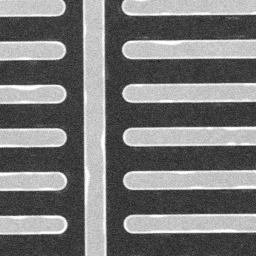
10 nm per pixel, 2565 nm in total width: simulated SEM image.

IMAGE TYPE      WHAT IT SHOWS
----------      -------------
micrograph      groups of lines, slits or small figures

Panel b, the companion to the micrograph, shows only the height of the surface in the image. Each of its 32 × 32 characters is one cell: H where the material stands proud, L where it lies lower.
HHHHHHHHLLLHHLLHHHHHHHHHHHHHHHHH
HHHHHHHHLLLHHLLLHHHHHHHHHHHHHHHH
LLLLLLLLLLLHHLLLLLLLLLLLLLLLLLLL
LLLLLLLLLLLHHLLLLLLLLLLLLLLLLLLL
LLLLLLLLLLLHHLLLLLLLLLLLLLLLLLLL
HHHHHHHHLLLHHLLLHHHHHHHHHHHHHHHH
HHHHHHHHLLLHHLLHHHHHHHHHHHHHHHHH
LLLLLLLLLLLHHLLLLLLLLLLLLLLLLLLL
LLLLLLLLLLLHHLLLLLLLLLLLLLLLLLLL
LLLLLLLLLLLHHLLLLLLLLLLLLLLLLLLL
LLLLLLLLLLLHHLLLLLLLLLLLLLLLLLLL
HHHHHHHHLLLHHLLHHHHHHHHHHHHHHHHH
HHHHHHHHLLLHHLLLHHHHHHHHHHHHHHHH
LLLLLLLLLLLHHLLLLLLLLLLLLLLLLLLL
LLLLLLLLLLLHHLLLLLLLLLLLLLLLLLLL
LLLLLLLLLLLHHLLLLLLLLLLLLLLLLLLL
HHHHHHHHLLLHHLLLHHHHHHHHHHHHHHHH
HHHHHHHHLLLHHLLLHHHHHHHHHHHHHHHH
LLLLLLLLLLLHHLLLLLLLLLLLLLLLLLLL
LLLLLLLLLLLHHLLLLLLLLLLLLLLLLLLL
LLLLLLLLLLLHHLLLLLLLLLLLLLLLLLLL
LLLLLLLLLLLHHLLLHHHHHHHHHHHHHHHH
HHHHHHHHLLLHHLLLHHHHHHHHHHHHHHHH
HHHHHHHHLLLHHLLLHHHHHHHHLHHHHHLL
LLLLLLLLLLLHHLLLLLLLLLLLLLLLLLLL
LLLLLLLLLLLHHLLLLLLLLLLLLLLLLLLL
LLLLLLLLLLLHHLLLLLLLLLLLLLLLLLLL
HHHHHHHHLLLHHLLLHHHHHHHHHHHHHHHH
HHHHHHHHLLLHHLLLHHHHHHHHHHHHHHHH
LLLLLLLLLLLHHLLLLLLLLLLLLLLLLLLL
LLLLLLLLLLLHHLLLLLLLLLLLLLLLLLLL
LLLLLLLLLLLHHLLLLLLLLLLLLLLLLLLL